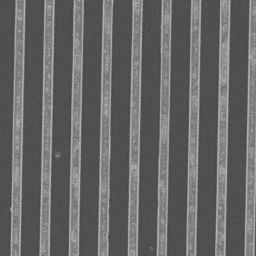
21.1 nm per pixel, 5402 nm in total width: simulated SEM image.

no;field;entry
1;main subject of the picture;parallel lines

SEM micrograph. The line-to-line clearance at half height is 435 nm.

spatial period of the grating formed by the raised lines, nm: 617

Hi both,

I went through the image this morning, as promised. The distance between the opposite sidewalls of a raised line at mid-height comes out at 177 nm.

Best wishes